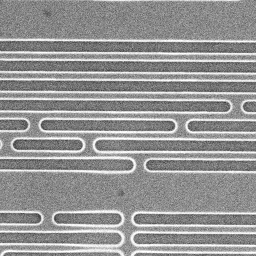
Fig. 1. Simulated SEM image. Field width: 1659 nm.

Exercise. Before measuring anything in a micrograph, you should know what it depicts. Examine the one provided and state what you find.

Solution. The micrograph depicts groups of lines, slits or small figures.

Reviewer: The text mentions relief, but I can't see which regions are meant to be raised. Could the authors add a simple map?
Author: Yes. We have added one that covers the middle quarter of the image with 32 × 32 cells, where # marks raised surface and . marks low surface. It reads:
................................
................................
################################
################################
................................
................................
................................
################################
################################
................................
................................
................................
################################
################################
............................###.
............................###.
............................###.
################################
################################
.....###........................
.....##.........................
....####........................
################################
...............#################
.................####...........
..................##............
.................####...........
################################
################################
################################
################################
################################